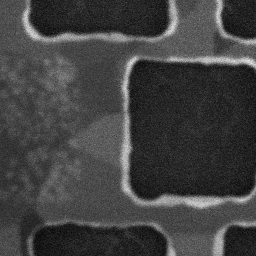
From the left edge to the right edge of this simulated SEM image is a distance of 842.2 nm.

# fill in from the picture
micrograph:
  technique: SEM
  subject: holes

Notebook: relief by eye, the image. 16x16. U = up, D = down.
UUDDDDDDDDDUUUDD
UUDDDDDDDDDUUUDD
UUUUUUUUUUUUUUUD
UUUUUUUUUUUUUUUU
UUUUUUUUDDDDDDDD
UUUUUUUUDDDDDDDD
UUUUUUUUDDDDDDDD
UUUUUUUUDDDDDDDD
UUUUUUUUDDDDDDDD
UUUUUUUUDDDDDDDD
UUUUUUUUDDDDDDDD
UUUUUUUUDDDDDDDD
UUUUUUUUUDDUUUUU
UUUUUUUUUUUUUUUU
UUDDDDDDDDUUUUDD
UUDDDDDDDDDUUUDD